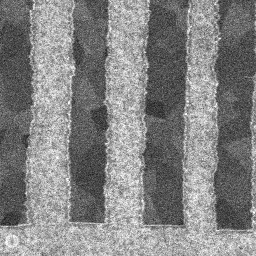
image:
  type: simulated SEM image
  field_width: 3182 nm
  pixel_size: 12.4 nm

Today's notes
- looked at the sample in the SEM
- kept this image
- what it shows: one or a few lines or trenches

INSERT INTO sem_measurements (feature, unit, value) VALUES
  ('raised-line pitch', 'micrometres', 0.924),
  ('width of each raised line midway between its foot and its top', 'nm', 480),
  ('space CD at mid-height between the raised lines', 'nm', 452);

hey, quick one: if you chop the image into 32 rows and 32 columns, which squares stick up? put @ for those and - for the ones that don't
@@@@-----@@@@@-----@@@@@---@@@@@
@@@@-----@@@@@-----@@@@@---@@@@@
@@@@-----@@@@@----@@@@@----@@@@@
@@@@-----@@@@@----@@@@@@---@@@@@
@@@@-----@@@@@----@@@@@----@@@@@
@@@@-----@@@@@----@@@@@----@@@@@
@@@@-----@@@@@----@@@@@----@@@@@
@@@@-----@@@@-----@@@@@----@@@@@
@@@@-----@@@@-----@@@@@@---@@@@@
@@@@-----@@@@-----@@@@@----@@@@@
@@@@-----@@@@-----@@@@@----@@@@@
@@@@-----@@@@-----@@@@@----@@@@@
@@@@-----@@@@-----@@@@@----@@@@@
@@@@-----@@@@-----@@@@@----@@@@@
@@@@-----@@@@@----@@@@@----@@@@@
@@@@-----@@@@@----@@@@@----@@@@-
@@@@-----@@@@-----@@@@@----@@@@@
@@@@----@@@@@-----@@@@@----@@@@@
@@@-----@@@@@-----@@@@@----@@@@@
@@@------@@@@-----@@@@@----@@@@-
@@@------@@@@-----@@@@@----@@@@@
@@@------@@@@-----@@@@@----@@@@@
@@@------@@@@-----@@@@@----@@@@@
@@@------@@@@-----@@@@@----@@@@@
@@@------@@@@-----@@@@@----@@@@@
@@@------@@@@-----@@@@@----@@@@@
@@@------@@@@-----@@@@@----@@@@@
@@@@-----@@@@-----@@@@@----@@@@@
---------------------------@@@@@
-@------------------------------
-@------------------------------
--------------------------------